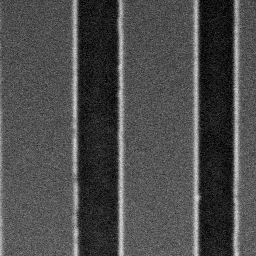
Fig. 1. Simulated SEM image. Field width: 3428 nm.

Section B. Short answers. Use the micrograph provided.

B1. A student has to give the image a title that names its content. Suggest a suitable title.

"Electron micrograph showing lines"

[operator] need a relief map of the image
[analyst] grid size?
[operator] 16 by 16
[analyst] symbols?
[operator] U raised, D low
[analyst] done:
UUUUUDDDUUUUDDDU
UUUUUDDDUUUUDDDU
UUUUUDDDUUUUDDDU
UUUUUDDDUUUUDDDU
UUUUUDDDUUUUDDDU
UUUUUDDDUUUUDDDU
UUUUUDDDUUUUDDDU
UUUUUDDDUUUUDDDU
UUUUUDDDUUUUDDDU
UUUUUDDDUUUUDDDU
UUUUUDDDUUUUDDDU
UUUUUDDDUUUUDDDU
UUUUUDDDUUUUDDDU
UUUUUDDDUUUUDDDU
UUUUUDDDUUUUDDDU
UUUUUDDDUUUUDDDU